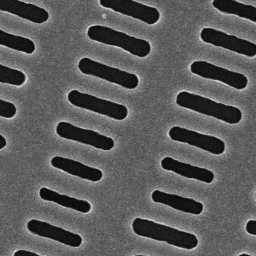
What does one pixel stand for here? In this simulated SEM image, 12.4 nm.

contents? a regular array of holes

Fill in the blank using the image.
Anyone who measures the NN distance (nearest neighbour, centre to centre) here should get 415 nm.